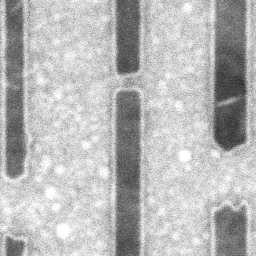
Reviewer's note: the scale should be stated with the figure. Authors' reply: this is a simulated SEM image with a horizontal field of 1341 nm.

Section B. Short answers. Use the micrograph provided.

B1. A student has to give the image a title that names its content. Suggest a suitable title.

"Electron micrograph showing one or a few lines or trenches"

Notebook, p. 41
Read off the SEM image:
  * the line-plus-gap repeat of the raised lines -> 108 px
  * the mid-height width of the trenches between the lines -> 412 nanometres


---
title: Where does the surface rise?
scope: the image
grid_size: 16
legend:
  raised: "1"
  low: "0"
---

1100000110000111
1100000110000110
1100000110000110
1100000110000111
1100000110000111
1100000000000111
1100000110000111
1100000110000111
1100000110000111
1100000110000000
1100000110000000
0000000110000000
0000000110000000
0000000110000111
0000000110000111
1100000110000111